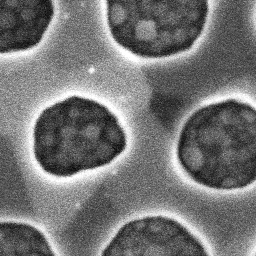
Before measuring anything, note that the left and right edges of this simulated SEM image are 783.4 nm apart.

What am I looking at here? holes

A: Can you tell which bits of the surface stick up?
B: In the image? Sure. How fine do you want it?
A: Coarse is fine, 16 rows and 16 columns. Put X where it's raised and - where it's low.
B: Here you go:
---XXXX------XXX
---XXXX------XXX
---XXXX-----XXXX
XXXXXXXXX--XXXXX
XXXXXXXXXXXXXXXX
XXXXXXXXXXXXXXXX
XXX---XXXXXXX---
XX-----XXXXX----
XX------XXX-----
XX------XXX-----
XXX---XXXXX-----
XXXXXXXXXXXX----
XXXXXXXXXXXXXXXX
XXXXXXXXX-XXXXXX
---XXXX-----XXXX
---XXXX------XXX